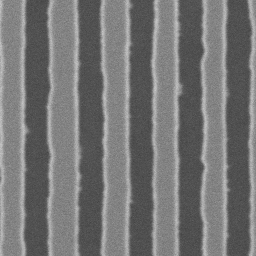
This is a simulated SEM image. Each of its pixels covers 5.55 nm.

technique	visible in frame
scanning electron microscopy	lines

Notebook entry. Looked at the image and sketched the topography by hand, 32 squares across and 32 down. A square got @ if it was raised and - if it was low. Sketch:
@@@---@@@@---@@@---@@@---@@@---@
@@@---@@@@---@@@---@@@----@@---@
@@@---@@@@---@@@---@@@---@@@---@
@@@---@@@@---@@@---@@@---@@@---@
@@@---@@@@---@@@---@@@---@@@---@
@@@---@@@@---@@@---@@@---@@@---@
@@@---@@@@---@@@---@@@----@@---@
@@@---@@@@---@@@---@@@---@@@---@
@@@---@@@@---@@@---@@@---@@@---@
@@@---@@@@---@@@---@@@---@@@---@
@@@---@@@@---@@@---@@@---@@@---@
@@@---@@@@---@@@---@@@---@@@---@
@@@---@@@@---@@@---@@@---@@@---@
@@@---@@@@---@@@---@@@---@@@---@
@@@---@@@@---@@@---@@@---@@@---@
@@@---@@@@---@@@---@@@----@@---@
@@@---@@@@---@@@---@@@----@@---@
@@@---@@@@---@@@---@@@----@@---@
@@@---@@@@---@@@---@@@---@@@---@
@@@---@@@@---@@@---@@@---@@@---@
@@@---@@@@---@@@---@@@---@@@---@
@@@---@@@@---@@@---@@@----@@---@
@@@---@@@@---@@@---@@@---@@@---@
@@@---@@@@---@@@---@@@---@@@---@
@@@---@@@@---@@@---@@@---@@@---@
@@@---@@@@---@@@---@@@---@@@---@
@@@---@@@@---@@@---@@@---@@@---@
@@@---@@@@---@@@---@@@---@@@---@
@@@---@@@@---@@@---@@@---@@@---@
@@@---@@@@---@@@---@@@---@@@---@
@@@---@@@@---@@@---@@@---@@@---@
@@@---@@@@---@@@---@@@---@@@---@